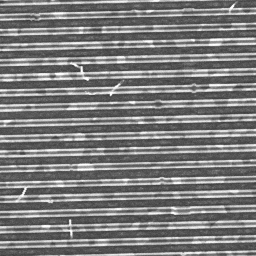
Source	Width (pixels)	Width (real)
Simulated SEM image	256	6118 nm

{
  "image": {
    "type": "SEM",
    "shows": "parallel lines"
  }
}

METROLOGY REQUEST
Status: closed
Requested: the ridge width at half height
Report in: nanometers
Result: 114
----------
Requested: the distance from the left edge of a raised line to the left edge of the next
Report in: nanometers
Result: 363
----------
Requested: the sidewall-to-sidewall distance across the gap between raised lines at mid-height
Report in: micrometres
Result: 0.251